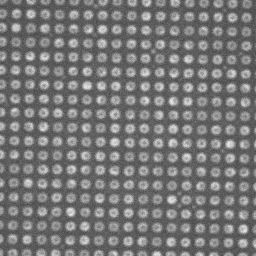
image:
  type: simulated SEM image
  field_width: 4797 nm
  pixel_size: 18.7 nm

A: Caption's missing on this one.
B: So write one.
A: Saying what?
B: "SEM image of a regular array of raised bodies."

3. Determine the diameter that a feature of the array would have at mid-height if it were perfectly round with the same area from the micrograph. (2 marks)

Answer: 7.74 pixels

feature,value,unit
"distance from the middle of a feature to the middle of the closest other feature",257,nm